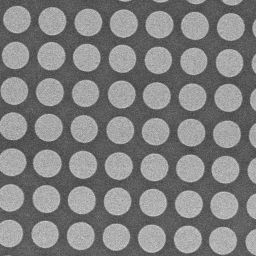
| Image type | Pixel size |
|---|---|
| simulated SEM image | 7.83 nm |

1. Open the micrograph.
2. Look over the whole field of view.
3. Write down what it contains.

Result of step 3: an array of small figures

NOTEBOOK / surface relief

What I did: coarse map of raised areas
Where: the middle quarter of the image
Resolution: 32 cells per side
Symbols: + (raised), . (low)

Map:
...+++++....+++++....++++++..+++
....+++......+++.....+++++....++
...............................+
................................
....+++......+++................
...+++++....+++++....++++.....++
..+++++++..+++++++..++++++...+++
..+++++++..+++++++..++++++...+++
..++++++...+++++++..++++++...+++
...+++++....+++++...++++++...+++
....++.......+++.....++++.....++
...............................+
................................
...++++......++.................
..++++++...++++++....++++.....++
..++++++...++++++...++++++...+++
..++++++...++++++...++++++...+++
..++++++...++++++...++++++..++++
...+++++...++++++...++++++...+++
............++++.....++++....+++
................................
................................
...++++.....+++.......+.........
..++++++...+++++....+++++....+++
.+++++++..+++++++...++++++...+++
.+++++++..+++++++..+++++++..++++
..++++++..+++++++..+++++++..++++
..+++++....+++++....++++++..++++
....++......+++......++++....+++
................................
................................
..+++++.....+++......++.........